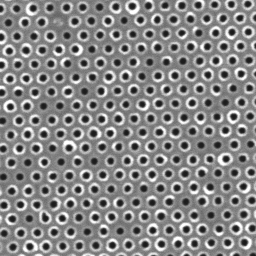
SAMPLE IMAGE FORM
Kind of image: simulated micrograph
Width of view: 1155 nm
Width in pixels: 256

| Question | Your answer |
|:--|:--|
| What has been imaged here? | a regular array of holes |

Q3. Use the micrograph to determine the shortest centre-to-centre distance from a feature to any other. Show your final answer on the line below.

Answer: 72.2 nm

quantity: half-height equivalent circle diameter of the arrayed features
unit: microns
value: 0.033